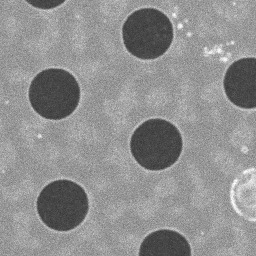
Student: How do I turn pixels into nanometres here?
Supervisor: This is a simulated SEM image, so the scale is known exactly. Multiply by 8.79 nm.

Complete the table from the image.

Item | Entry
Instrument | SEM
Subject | holes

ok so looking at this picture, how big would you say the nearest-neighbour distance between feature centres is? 0.977 um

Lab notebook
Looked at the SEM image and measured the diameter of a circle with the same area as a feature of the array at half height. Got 52.1 px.